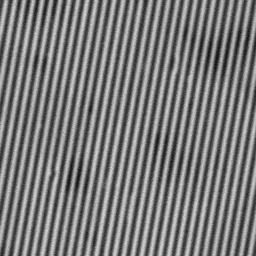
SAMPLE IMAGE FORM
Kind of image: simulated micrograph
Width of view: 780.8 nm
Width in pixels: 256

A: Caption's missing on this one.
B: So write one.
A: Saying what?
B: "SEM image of parallel lines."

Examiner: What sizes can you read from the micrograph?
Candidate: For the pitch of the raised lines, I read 27.1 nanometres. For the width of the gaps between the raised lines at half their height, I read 0.0196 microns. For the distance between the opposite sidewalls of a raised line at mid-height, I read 8.3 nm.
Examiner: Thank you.